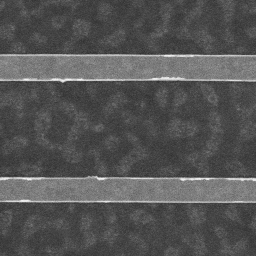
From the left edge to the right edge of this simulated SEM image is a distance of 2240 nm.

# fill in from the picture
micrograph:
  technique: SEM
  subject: one or a few lines or trenches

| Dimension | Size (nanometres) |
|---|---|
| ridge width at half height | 219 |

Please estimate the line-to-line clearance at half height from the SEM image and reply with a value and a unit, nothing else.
851 nm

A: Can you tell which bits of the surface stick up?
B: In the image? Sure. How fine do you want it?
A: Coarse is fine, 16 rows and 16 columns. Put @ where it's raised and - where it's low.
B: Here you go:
----------------
----------------
----------------
@@@@@@@@@@@@@@@@
@@@@@@@@@@@@@@@@
----------------
----------------
----------------
----------------
----------------
----------------
@@@@@@@@@@@@@@@@
@@@@@@@@@@@@@@@@
----------------
----------------
----------------